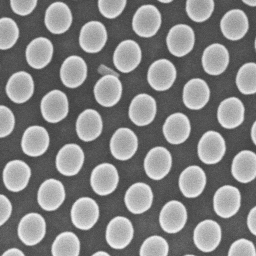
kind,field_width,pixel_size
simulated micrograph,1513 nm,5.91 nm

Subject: a regular array of raised bodies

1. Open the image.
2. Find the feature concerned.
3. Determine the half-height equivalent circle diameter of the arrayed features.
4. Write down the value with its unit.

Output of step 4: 171 nanometres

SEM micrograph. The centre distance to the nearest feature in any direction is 0.231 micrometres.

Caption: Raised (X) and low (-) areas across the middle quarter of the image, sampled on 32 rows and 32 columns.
XXXXXX-------XXXXX----XXXXX-----
XXXXXX--------XXX----XXXXXXX----
XXXXX----------------XXXXXXX----
XXXXX-----XXX--------XXXXXXX----
XXXXX---XXXXXX-------XXXXXX----X
-XX-----XXXXXX--------XXXXX---XX
--------XXXXXX----------X-----XX
--------XXXXXX----------------XX
X-------XXXXXX----XXXX--------XX
X--------XXXX----XXXXXX-------XX
X----------------XXXXXX--------X
X-----X---------XXXXXXX---------
X---XXXXX-------XXXXXXX-----X---
----XXXXX--------XXXXX----XXXXX-
---XXXXXX--------XXXXX---XXXXXX-
---XXXXXX----------------XXXXXX-
---XXXXXX----XXX---------XXXXXX-
----XXXXX----XXXX--------XXXXXX-
----XXXX----XXXXXX-------XXXXXX-
------------XXXXXX---------XX---
-XX---------XXXXXX--------------
XXXX--------XXXXXX----XXXX------
XXXXX-------XXXXX----XXXXX------
XXXXX--------XXX-----XXXXXX-----
XXXXX---------------XXXXXXX-----
XXXX-----XXX--------XXXXXXX-----
XXXX----XXXXX-------XXXXXX----XX
XXX----XXXXXX--------XXXXX---XXX
-------XXXXXX---------XX-----XXX
-------XXXXXX----------------XXX
-------XXXXXX----XXXX--------XXX
--------XXXX----XXXXXX-------XXX